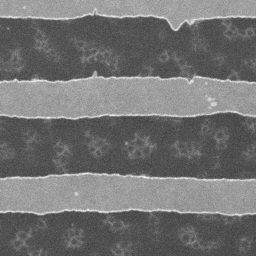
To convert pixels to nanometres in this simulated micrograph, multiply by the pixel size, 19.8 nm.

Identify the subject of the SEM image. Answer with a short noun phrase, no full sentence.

one or a few lines or trenches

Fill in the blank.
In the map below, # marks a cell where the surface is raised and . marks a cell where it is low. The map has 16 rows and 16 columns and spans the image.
................
################
################
################
################
................
................
################
################
################
################
................
................
################
################
################